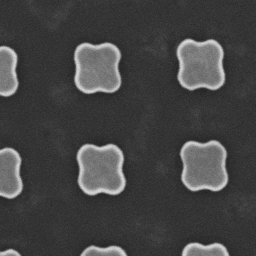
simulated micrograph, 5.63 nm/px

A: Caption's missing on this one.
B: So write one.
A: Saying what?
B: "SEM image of raised bodies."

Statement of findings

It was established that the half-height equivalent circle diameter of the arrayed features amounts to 274 nm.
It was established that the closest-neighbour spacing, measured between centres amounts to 570 nm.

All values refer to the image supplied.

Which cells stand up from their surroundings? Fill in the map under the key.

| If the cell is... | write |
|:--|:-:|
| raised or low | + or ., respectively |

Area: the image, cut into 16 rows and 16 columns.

................
................
................
+....++....+++..
+....++....+++..
+....++.........
................
................
................
+....++....+++..
+....+++...+++..
+....+++....++..
................
................
................
............++..